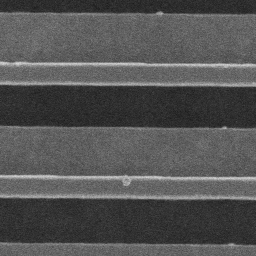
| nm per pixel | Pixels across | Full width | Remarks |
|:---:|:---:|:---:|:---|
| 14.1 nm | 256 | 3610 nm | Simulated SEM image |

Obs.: lines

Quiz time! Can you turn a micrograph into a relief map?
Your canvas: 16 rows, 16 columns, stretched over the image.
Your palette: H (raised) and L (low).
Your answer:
LLLLLLLLLLLLLLLL
HHHHHHHHHHHHHHHH
HHHHHHHHHHHHHHHH
HHHHHHHHHHHHHHHH
HHHHHHHHHHHHHHHH
LLLLLLLLLLLLLLLL
LLLLLLLLLLLLLLLL
LLLLLLLLLLLLLLLL
HHHHHHHHHHHHHHHH
HHHHHHHHHHHHHHHH
HHHHHHHHHHHHHHHH
HHHHHHHHHHHHHHHH
LLLLLLLLLLLLLLLL
LLLLLLLLLLLLLLLL
LLLLLLLLLLLLLLLL
HHHHHHHHHHHHHHHH